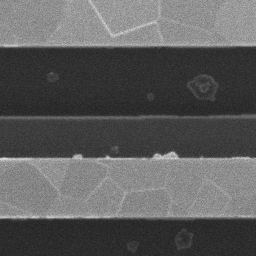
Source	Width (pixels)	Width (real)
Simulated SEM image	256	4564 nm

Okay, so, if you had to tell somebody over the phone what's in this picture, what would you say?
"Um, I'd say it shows lines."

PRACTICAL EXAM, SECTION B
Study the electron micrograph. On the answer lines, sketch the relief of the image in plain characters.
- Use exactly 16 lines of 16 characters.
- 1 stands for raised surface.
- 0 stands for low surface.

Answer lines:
1111111111111111
1111111111111111
1111111111111111
0000000000000000
0000000000000000
0000000000000000
0000000000000000
1111111111111111
1111111111111111
1111111111111111
1111111111111111
1111111111111111
1111111111111111
1111111111111111
0000000000000000
0000000000000000